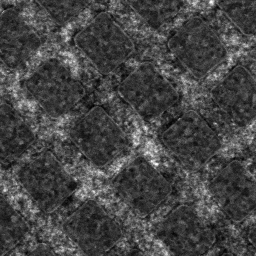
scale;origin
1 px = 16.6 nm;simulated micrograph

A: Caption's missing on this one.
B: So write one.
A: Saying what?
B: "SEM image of a regular array of raised bodies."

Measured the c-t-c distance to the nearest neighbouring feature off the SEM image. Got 1090 nanometres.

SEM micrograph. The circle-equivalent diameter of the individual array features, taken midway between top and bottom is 863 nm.